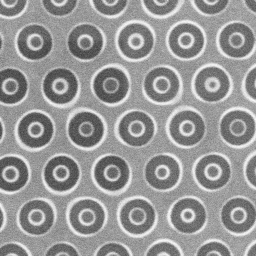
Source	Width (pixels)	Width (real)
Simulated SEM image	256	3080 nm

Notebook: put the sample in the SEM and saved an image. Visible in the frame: an array of small figures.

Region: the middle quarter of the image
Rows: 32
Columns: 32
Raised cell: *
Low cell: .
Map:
***********..*******************
..*******......*******.....*****
..******........*****.......****
...****.........****....*....***
....***...***...****...***...***
....***...****...***...***...***
....***...***...****...***...***
...*****........****.........***
...*****.......******.......****
..********....*********....*****
********************************
****..***********.***********...
**......*******......******.....
*........*****........*****.....
*.........****....*...****....*.
*...***...***...****...***...***
*...***...***...****...***...***
*...***...***....**....***....*.
*.........****........*****.....
**.......******......*******....
***.....*********...*********...
********************************
************************..******
..*******......*******......****
...*****.......******........***
....***....**...****.........***
*...***...****...***...***...***
*...***...****...***...***...***
*...***....**....***....*....***
....****........*****........***
...******.......******......****
..********.....********...******